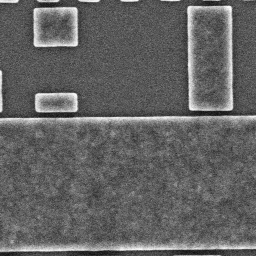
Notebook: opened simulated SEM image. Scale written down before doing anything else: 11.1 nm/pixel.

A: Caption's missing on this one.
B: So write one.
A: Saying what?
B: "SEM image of wiring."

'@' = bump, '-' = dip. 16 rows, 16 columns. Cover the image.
--@@--------@@--
--@@@-------@@--
--@@@-------@@--
------------@@--
------------@@--
------------@@--
--@@@-------@@--
@@@@@@@@@@@@@@@@
@@@@@@@@@@@@@@@@
@@@@@@@@@@@@@@@@
@@@@@@@@@@@@@@@@
@@@@@@@@@@@@@@@@
@@@@@@@@@@@@@@@@
@@@@@@@@@@@@@@@@
@@@@@@@@@@@@@@@@
@@@@@@@@@@@@@@@@